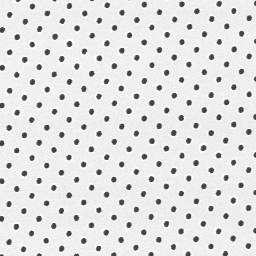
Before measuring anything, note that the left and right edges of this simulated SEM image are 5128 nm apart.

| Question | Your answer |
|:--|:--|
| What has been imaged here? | a regular array of holes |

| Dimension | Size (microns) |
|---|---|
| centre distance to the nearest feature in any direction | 0.33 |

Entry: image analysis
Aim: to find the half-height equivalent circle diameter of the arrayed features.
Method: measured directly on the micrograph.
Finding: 117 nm